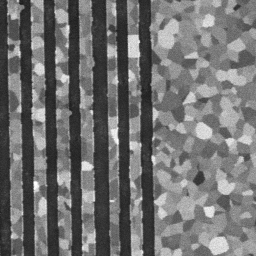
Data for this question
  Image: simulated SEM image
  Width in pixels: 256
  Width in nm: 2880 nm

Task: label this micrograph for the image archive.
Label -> parallel lines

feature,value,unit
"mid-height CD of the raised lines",124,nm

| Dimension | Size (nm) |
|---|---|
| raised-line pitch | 269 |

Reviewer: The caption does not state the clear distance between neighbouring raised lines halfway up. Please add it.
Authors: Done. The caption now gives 143 nm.